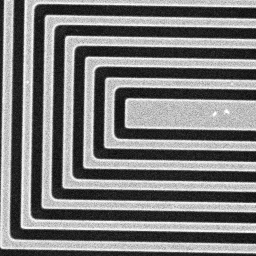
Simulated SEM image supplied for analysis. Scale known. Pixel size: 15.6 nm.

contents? groups of lines, slits or small figures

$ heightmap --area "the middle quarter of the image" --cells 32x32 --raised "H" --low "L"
HHLLLHHHHHHHHHHHHHHHHHHHHHHHHHHH
HHLLLHHHLLLLLLLLLLLLLLLLLLLLLLLL
HHLLLHHHLLLLLLLLLLLLLLLLLLLLLLLL
HHLLLHHHLLLHHHHHHHHHHHLLLLLLLLLL
HHLLLHHLLLHHHHHHHHHHHHHHHHHHHHHH
HHLLLHHLLLHHHHHHHHHHHHHHHHHHHHHH
HHLLLHHLLLHHHLLLLLLLLLLLLLLLLLLL
HHLLLHHLLLHHHLLLLLLLLLLLLLLLLLLL
HHLLLHHLLLHHHLLLLLLLLLLLLLLLLLLL
HHLLLHHLLLHHHLLHHHHHHHHHHHHHHHHH
HHLLLHHLLLHHHLLHHHHHHHHHHHHHHHHH
HHLLLHHLLLHHLLLHHHHHHHHHHHHHHHHH
HHLLLHHLLLHHLLLHHHHHHHHHHHHHHHHH
HHLLLHHLLLHHLLLHHHHHHHHHHHHHHHHH
HHLLLHHLLLHHLLLHHHHHHHHHHHHHHHHH
HHLLLHHLLLHHLLLHHHHHHHHHHHHHHHHH
HHLLLHHLLLHHLLLLLLLLLLLLLLLLLLLL
HHLLLHHLLLHHHLLLLLLLLLLLLLLLLLLL
HHLLLHHLLLHHHHLLLLLLLLLLLLLLLLLL
HHLLLHHLLLHHHHHHHHHHHHHHHHHHHHHH
HHLLLHHLLLHHHHHHHHHHHHHHHHHHHHHH
HHLLLHHLLLLLLLLLLLLLLLLLLLLLLLLH
HHLLLHHLLLLLLLLLLLLLLLLLLLLLLLLL
HHLLLHHHLLLLLLLLLLLLLLLLLLLLLLLL
HHLLLHHHHHHHHHHHHHHHHHHHHHHHHHHH
HHLLLHHHHHHHHHHHHHHHHHHHHHHHHHHH
HHLLLLLLLLLLLLLLLLLLLLLLHHHHHHHH
HHLLLLLLLLLLLLLLLLLLLLLLLLLLLLLL
HHHLLLLLLLLLLLLLLLLLLLLLLLLLLLLL
HHHHHHHHHHHHHHHHHHHHHHHHHHHHHHHH
HHHHHHHHHHHHHHHHHHHHHHHHHHHHHHHH
LLLLLLLLLLLLLLLLLHHHHHHHHHHHHHHH